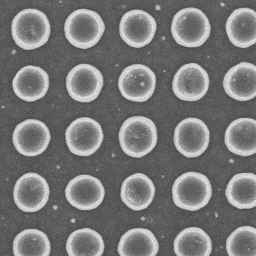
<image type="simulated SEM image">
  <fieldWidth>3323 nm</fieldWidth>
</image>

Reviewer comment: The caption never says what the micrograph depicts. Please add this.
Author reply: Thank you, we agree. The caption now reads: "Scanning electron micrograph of a regular array of raised bodies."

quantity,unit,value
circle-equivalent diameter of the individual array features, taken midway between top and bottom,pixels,34.6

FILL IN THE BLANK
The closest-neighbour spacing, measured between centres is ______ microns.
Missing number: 0.688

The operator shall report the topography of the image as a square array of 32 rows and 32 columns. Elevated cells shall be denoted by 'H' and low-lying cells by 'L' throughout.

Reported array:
LLLLLLLLLLLLLLLLLLLLLLLLLLLLLLLL
LLLHHLLLLLHLLLLLHHLLLLLHHLLLLLHL
LLHHHHLLLHHHLLLHHHHLLLHHHHLLLHHH
LLHHHHLLHHHHHLLHHHHLLLHHHHLLHHHH
LLHHHHLLHHHHLLLHHHHLLLHHHHLLLHHH
LLLHHLLLLHHLLLLLHHLLLLLHLLLLLLHL
LLLLLLLLLLLLLLLLLLLLLLLLLLLLLLLL
LLLLLLLLLLLLLLLLLLLLLLLLLLLLLLLL
LLLHHLLLLLHLLLLLHHLLLLLHHLLLLHHH
LLHHHHLLLHHHLLLHHHHLLLHHHHLLHHHH
LLHHHHLLLHHHLLLHHHHLLLHHHHLLHHHH
LLHHHHLLLHHHLLLHHHHLLLHHHHLLLHHH
LLLLLLLLLLLLLLLLLLLLLLLLLLLLLLLL
LLLLLLLLLLLLLLLLLLLLLLLLLLLLLLLL
LLLLLLLLLLLLLLLLLLLLLLLLLLLLLLLL
LLLHHLLLLHHHLLLLHHHLLLLHHLLLLHHH
LLHHHHLLHHHHHLLHHHHLLLHHHHLLHHHH
LLHHHHLLHHHHHLLHHHHLLLHHHHLLHHHH
LLHHHLLLLHHHLLLHHHHLLLHHHHLLLHHH
LLLLLLLLLLLLLLLLLLLLLLLLLLLLLLLL
LLLLLLLLLLLLLLLLLLLLLLLLLLLLLLLL
LLLLLLLLLLLLLLLLLLLLLLLLLLLLLLLL
LLLHHLLLLHHHLLLLHHHLLLHHHHLLLHHH
LLHHHHLLLHHHHLLHHHHLLLHHHHLLHHHH
LLHHHHLLHHHHHLLHHHHLLLHHHHLLHHHH
LLHHHLLLLHHHLLLLHHLLLLHHHLLLLHHH
LLLLLLLLLLLLLLLLLLLLLLLLLLLLLLLL
LLLLLLLLLLLLLLLLLLLLLLLLLLLLLLLL
LLLLLLLLLLLLLLLLLLLLLLLLLLLLLLLL
LLHHHLLLLHHHLLLLHHHLLLHHHHLLLHHH
LLHHHHLLHHHHHLLHHHHLLLHHHHLLLHHH
LLHHHHLLLHHHHLLHHHHLLLHHHHLLLHHH